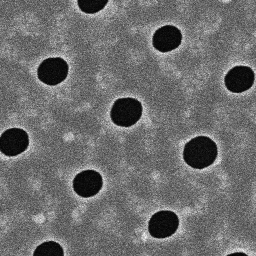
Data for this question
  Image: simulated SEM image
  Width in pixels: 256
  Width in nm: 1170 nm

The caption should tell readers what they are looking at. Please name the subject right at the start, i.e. holes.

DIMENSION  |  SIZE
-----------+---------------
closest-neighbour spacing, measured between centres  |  0.371 microns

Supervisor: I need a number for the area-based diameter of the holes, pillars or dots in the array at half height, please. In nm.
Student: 135